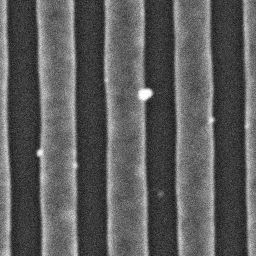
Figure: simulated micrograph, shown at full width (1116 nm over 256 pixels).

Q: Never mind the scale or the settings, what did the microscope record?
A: wiring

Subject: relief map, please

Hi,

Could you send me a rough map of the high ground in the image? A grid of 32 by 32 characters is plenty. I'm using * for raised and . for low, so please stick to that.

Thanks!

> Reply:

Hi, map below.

*....****....*****....****.....*
*....****....*****....****.....*
*....****....*****....****.....*
*....****....*****....****.....*
*....****....*****....****.....*
*....****....*****....****.....*
*....****....*****....****.....*
*....****....*****....****.....*
*....****....*****....****.....*
*....****....*****....****.....*
*....****....*****....****.....*
*....****....******...****.....*
*....****.....****....****.....*
*....****.....****....****.....*
*....****.....****....****.....*
*....****.....****....****.....*
*....****.....****....****.....*
*....****.....****....*****....*
*....****.....****....*****....*
*....****.....****....*****....*
*....****.....****....*****....*
*....****.....****....****.....*
*....****.....****....*****....*
*....****.....****....*****....*
*....****.....****....*****....*
*....****.....****....*****....*
*....****.....****....*****....*
*....****.....****....*****....*
*....****.....****....*****....*
*....****.....****....*****....*
*....****.....****....*****....*
*....****.....****....*****....*